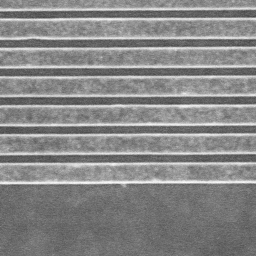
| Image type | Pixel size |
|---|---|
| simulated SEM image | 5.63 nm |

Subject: parallel lines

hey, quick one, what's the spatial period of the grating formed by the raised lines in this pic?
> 0.163 µm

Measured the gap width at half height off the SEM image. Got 49.3 nm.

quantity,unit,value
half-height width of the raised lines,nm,113